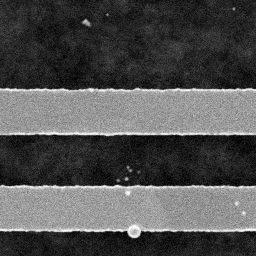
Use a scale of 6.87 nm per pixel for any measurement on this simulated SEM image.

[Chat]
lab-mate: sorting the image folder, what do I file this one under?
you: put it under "lines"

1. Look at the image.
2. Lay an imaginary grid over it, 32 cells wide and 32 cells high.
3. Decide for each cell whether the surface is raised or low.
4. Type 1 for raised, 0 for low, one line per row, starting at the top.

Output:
00000000000000000000000000000000
00000000000000000000000000000000
00000000000000000000000000000000
00000000000000000000000000000000
00000000000000000000000000000000
00000000000000000000000000000000
00000000000000000000000000000000
00000000000000000000000000000000
00000000000000000000000000000000
00000000000000000000000000000000
00000000000000000000000000000000
11111111111111111111111111111111
11111111111111111111111111111111
11111111111111111111111111111111
11111111111111111111111111111111
11111111111111111111111111111111
11111111111111111111111111111111
00000000000000000000000000000000
00000000000000000000000000000000
00000000000000000000000000000000
00000000000000000000000000000000
00000000000000000000000000000000
00000000000000000000000000000000
11111111111111111111111111111111
11111111111111111111111111111111
11111111111111111111111111111111
11111111111111111111111111111111
11111111111111111111111111111111
11111111111111111111111111111111
00000000000000001000000000000000
00000000000000000000000000000000
00000000000000000000000000000000